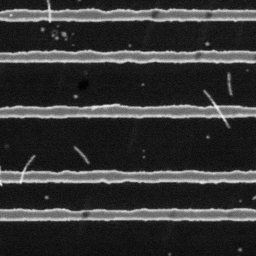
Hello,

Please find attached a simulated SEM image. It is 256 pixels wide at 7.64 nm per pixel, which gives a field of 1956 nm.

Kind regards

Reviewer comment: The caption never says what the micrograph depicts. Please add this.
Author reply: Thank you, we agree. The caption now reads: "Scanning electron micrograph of lines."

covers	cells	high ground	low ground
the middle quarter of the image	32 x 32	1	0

00000000000000000000000000000000
00000000000000000000000000000000
00000000000000000000000000000000
00000000000000000000000000000000
00000000000000000000000000000000
00000000000000000000000000000000
00000000000000000000000000000000
00000000000000000000000000000000
00000000000000000000000000000000
00000000000000000000000000000000
00000000011111100000000000011111
11111111111111111111111111111111
11111111111111111111111111111111
00000000000000000000000000000000
00000000000000000000000000000000
00000000000000000000000000000000
00000000000000000000000000000000
00000000000000000000000000000000
00000000000000000000000000000000
00000000000000000000000000000000
00000000000000000000000000000000
00000000000000000000000000000000
00000000000000000000000000000000
00000000000000000000000000000000
00000000000000000000000000000000
00000000000000000000000000000000
00000000000000000000000000000000
11111111111111111111111111111111
11111111111111111111111111111111
00111111001111100000111100000000
00000000000000000000000000000000
00000000000000000000000000000000